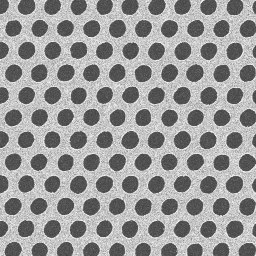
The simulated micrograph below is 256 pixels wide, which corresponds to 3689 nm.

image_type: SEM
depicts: a regular array of holes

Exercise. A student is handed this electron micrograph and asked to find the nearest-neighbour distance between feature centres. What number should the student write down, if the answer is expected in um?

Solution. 0.367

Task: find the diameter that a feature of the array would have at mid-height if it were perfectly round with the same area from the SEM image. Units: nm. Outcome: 247